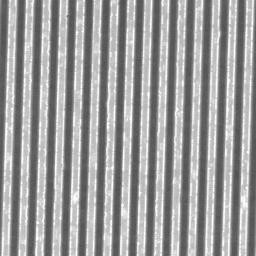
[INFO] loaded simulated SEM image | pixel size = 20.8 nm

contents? parallel lines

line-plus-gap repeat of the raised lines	352	nm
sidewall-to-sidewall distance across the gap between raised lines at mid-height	177	nm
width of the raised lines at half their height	177	nanometres